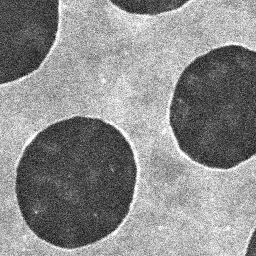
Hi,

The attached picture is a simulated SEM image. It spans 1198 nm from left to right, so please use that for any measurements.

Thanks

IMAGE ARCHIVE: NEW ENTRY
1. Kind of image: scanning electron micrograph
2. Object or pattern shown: holes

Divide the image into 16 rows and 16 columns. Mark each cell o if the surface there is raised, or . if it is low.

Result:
....ooo....ooooo
....oooooooooooo
...ooooooooooooo
...oooooooooo...
..ooooooooo.....
ooooooooooo.....
ooooooooooo.....
oooo..ooooo.....
oo......ooo.....
o.......ooo.....
o........oooo.oo
o........ooooooo
o.......oooooooo
o.......oooooooo
oo.....ooooooooo
oooo.oooooooooo.